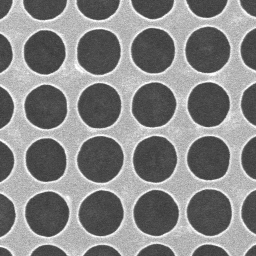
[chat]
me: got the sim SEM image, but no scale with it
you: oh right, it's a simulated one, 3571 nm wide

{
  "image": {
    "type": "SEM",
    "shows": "a regular array of holes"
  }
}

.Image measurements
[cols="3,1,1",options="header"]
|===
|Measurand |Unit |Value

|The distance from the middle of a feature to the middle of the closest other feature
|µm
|0.751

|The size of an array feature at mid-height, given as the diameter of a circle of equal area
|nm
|628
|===